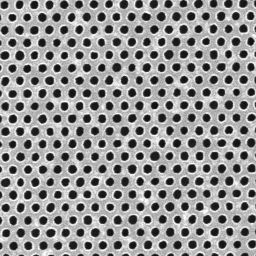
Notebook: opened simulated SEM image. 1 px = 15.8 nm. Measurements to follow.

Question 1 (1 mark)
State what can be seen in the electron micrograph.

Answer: a regular array of holes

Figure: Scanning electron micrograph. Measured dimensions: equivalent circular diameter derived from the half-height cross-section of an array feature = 140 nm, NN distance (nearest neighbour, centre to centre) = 227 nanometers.